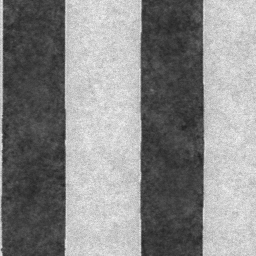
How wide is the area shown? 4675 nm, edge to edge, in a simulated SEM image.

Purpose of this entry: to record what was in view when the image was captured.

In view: one or a few lines or trenches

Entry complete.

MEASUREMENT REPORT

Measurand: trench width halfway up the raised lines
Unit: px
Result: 64.2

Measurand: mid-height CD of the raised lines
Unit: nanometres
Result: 1360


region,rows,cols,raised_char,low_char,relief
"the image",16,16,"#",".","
....#####....###
....#####....###
....#####....###
....#####....###
....#####....###
....#####....###
....#####....###
....#####....###
....#####....###
....#####....###
....#####....###
....#####....###
....#####....###
....#####....###
....#####....###
....#####....###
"